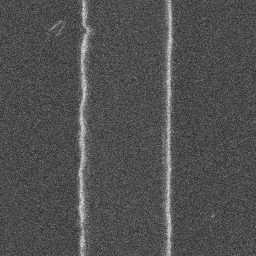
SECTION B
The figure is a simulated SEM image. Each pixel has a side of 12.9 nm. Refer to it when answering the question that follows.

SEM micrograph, one or a few lines or trenches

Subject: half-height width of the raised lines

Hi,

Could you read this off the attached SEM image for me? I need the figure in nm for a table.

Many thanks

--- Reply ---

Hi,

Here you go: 1110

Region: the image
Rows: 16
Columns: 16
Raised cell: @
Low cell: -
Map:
-----@@@@@@-----
-----@@@@@@-----
-----@@@@@@-----
-----@@@@@@-----
-----@@@@@@-----
-----@@@@@@-----
-----@@@@@@-----
-----@@@@@@-----
-----@@@@@@-----
-----@@@@@@-----
-----@@@@@@-----
-----@@@@@@-----
-----@@@@@@-----
-----@@@@@@-----
-----@@@@@@-----
-----@@@@@@-----